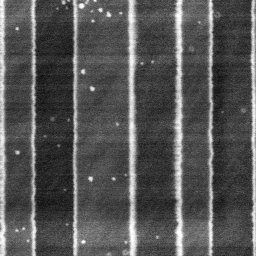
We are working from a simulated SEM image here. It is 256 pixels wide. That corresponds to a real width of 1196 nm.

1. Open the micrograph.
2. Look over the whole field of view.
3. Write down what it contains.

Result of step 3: lines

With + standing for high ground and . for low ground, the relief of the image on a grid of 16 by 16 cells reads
++...+++...++...
++...+++...++...
++...+++...++...
++...+++...++...
++...+++...++...
++...+++...++...
++...+++...++...
++...+++...++...
++...+++...++...
++...+++...++...
++...+++...++...
++...+++...++...
++...+++...++...
++...+++...++...
++...+++...++...
++...+++...++...